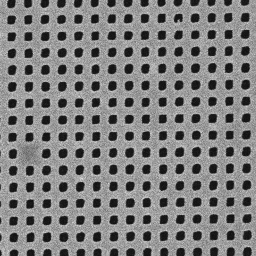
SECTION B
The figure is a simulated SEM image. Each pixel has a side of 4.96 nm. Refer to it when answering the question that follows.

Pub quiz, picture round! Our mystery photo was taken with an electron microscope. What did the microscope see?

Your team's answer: a regular array of holes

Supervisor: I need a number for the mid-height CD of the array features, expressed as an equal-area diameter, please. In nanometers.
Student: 47.2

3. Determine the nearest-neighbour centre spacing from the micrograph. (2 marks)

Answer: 82.4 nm